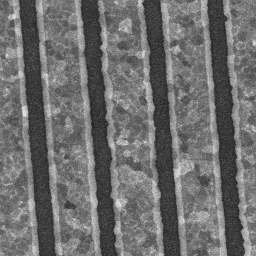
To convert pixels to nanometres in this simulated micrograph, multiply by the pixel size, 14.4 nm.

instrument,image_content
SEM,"one or a few lines or trenches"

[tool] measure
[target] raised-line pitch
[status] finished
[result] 900 nm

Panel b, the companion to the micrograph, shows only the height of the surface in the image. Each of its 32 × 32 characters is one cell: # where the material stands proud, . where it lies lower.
##...#####...#####..######..####
##...#####...#####...#####..####
##...#####...#####...#####...###
##...#####...#####...#####..####
##...#####...#####...#####...###
###..#####...#####...#####...###
###..#####...#####...#####...###
###..#####...#####...#####...###
###..#####...#####...#####...###
###..######..#####...#####...###
###...#####..######..#####...###
###...#####..######..#####...###
###...#####...#####..######..###
###...#####...#####..######..###
###...#####..######...#####..###
###...#####...#####...#####..###
###...#####...#####...#####..###
###...#####...#####...#####...##
###...#####...#####...#####...##
####..#####...#####...#####...##
####..######..#####...#####...##
####...#####..#####...#####...##
####...#####..#####...#####...##
####...#####..######..#####...##
####...#####..######..#####...##
####...#####...#####..######..##
####...#####...#####...#####..##
####...#####...#####...#####..##
####...#####...#####...#####...#
####...#####...#####...#####...#
####...#####...#####...#####...#
#####..#####...#####...#####...#